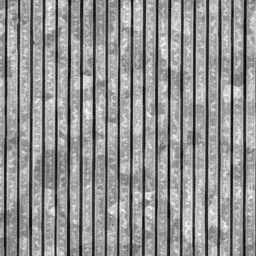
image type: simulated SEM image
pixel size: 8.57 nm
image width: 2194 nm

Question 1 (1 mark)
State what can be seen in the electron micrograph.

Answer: parallel lines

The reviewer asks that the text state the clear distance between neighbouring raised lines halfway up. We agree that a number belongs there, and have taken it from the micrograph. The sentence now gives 30 nm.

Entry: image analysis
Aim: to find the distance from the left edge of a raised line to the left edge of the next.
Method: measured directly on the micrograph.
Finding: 108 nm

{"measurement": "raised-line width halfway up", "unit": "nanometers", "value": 81.4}